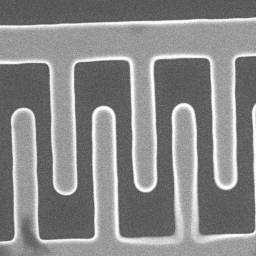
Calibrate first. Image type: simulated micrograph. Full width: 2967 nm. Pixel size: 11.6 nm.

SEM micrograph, groups of lines, slits or small figures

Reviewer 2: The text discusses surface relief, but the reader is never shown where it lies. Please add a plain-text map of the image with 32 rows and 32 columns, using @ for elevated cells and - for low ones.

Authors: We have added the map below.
--------------------------------
--------------------------------
------------------------@@@@@@@@
@@@@@@@@@@@@@@@@@@@@@@@@@@@@@@@@
@@@@@@@@@@@@@@@@@@@@@@@@@@@@@@@@
@@@@@@@@@@@@@@@@@@@@@@@@@@@@@@@@
@@@@@@@@@@@@@@@@@@@@@@@@@@@@@@@@
@@@@@@@@@@@@----@@@-------@@@@--
------@@@-------@@@-------@@@---
------@@@-------@@@-------@@@---
------@@@--------@@--------@@---
------@@@--------@@--------@@---
------@@@--------@@--------@@---
------@@@--------@@---@@---@@---
--@@---@@---@@---@@---@@---@@---
--@@---@@---@@---@@---@@---@@---
--@@---@@---@@---@@---@@---@@---
--@@---@@---@@---@@---@@---@@---
--@@---@@---@@---@@---@@---@@---
--@@---@@---@@---@@---@@---@@---
--@@---@@---@@---@@---@@---@@---
--@@@--@@@--@@---@@---@@---@@---
--@@@--@@@--@@---@@---@@---@@---
--@@@--@@---@@---@@---@@--------
--@@@-------@@@-------@@--------
--@@@-------@@@-------@@--------
--@@@-------@@@-------@@--------
--@@@-------@@@-------@@--------
--@@@-------@@@-------@@--------
--@@@-------@@@-------@@@--@@@@@
@@@@@@@@@@@@@@@@@@@@@@@@@@@@@@@@
@@@@@@@@@@@@@@@@@@@@@@@@@@@@@@@@